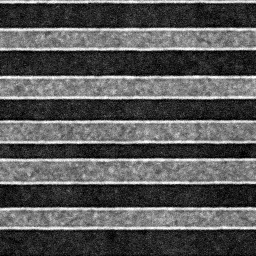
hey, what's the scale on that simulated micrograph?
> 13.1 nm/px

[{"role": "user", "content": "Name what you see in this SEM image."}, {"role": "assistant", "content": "parallel lines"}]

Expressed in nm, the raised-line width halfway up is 277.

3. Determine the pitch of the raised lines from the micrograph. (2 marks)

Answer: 587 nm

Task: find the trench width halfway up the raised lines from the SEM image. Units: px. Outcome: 25.8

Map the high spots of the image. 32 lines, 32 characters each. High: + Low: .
................................
................................
................................
................................
++++++++++++++++++++++++++++++++
++++++++++++++++++++++++++++++++
................................
................................
................................
................................
++++++++++++++++++++++++++++++++
++++++++++++++++++++++++++++++++
................................
................................
................................
++++++++++++++++++++++++++++++++
++++++++++++++++++++++++++++++++
++++++++++++++++++++++++++++++++
................................
................................
++++++++++++++++++++++++++++++++
++++++++++++++++++++++++++++++++
++++++++++++++++++++++++++++++++
................................
................................
................................
++++++++++++++++++++++++++++++++
++++++++++++++++++++++++++++++++
.....+...................++.....
................................
................................
................................